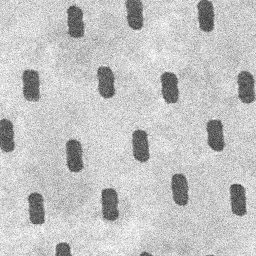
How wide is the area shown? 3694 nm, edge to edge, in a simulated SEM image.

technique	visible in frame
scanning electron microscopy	a regular array of holes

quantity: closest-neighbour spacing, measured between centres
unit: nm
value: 863